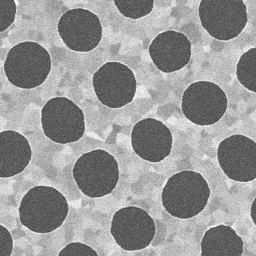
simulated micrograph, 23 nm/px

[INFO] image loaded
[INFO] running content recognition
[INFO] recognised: a regular array of holes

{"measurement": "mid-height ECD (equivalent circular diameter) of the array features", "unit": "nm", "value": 1060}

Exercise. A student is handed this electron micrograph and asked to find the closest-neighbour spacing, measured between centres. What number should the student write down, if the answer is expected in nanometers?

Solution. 1440